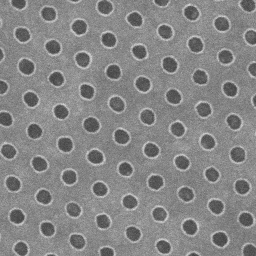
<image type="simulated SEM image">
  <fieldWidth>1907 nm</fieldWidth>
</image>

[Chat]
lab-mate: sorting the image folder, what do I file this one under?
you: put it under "a regular array of holes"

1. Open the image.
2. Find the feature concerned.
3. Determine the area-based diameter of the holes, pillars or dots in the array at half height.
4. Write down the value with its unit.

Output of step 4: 15.7 pixels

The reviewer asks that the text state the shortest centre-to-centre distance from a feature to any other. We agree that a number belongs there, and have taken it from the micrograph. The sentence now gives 240 nm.